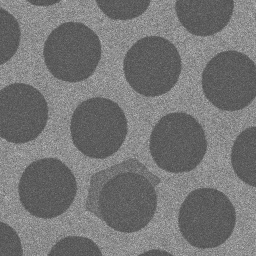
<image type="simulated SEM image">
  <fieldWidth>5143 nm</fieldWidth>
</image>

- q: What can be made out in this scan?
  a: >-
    holes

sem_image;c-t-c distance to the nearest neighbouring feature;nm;1550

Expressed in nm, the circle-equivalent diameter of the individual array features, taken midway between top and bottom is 1200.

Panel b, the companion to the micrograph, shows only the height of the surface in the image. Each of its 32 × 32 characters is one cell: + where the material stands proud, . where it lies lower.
++++...+++++.......+++.......+++
.++++++++++++.....++++.......+++
..+++++++++++++.++++++.......+++
...++++....++++++++++++.....++++
...+++......+++++++.+++++.++++++
..++++.......++++.....++++++++++
..+++........+++......++++++..++
.++++.......+++........+++.....+
++++++......+++........+++......
+++++++....+++++......+++.......
+..+++++++++++++......+++.......
.....++++++++++++....++++.......
......+++++...++++++++++++......
......++++.....++++++++++++....+
......+++.......++++....++++++++
......+++.......+++......+++++++
.....++++.......+++.......++++..
+...+++++.......+++.......+++...
++++++++++.....++++.......+++...
+++++++++++...+++++.......+++...
++++....++++++....++.....++++...
+++......+++.......++..++++++...
++.......++.........++++++++++..
++........+.........+++++.++++++
++.......++.........+++.....++++
+++......++.........+++......+++
+++.....+++........+++.......+++
+++++++++++++......+++........++
..++++++++++++....++++.......+++
..+++++++.+++++++++++++......+++
...++++.....++++++++++++....++++
...+++.......+++++...+++++++++++